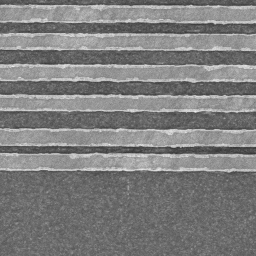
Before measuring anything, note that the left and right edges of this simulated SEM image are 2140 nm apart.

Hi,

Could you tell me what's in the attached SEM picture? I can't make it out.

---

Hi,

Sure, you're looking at parallel lines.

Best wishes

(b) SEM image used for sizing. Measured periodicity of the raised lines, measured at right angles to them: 248 nm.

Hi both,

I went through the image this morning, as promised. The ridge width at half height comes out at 135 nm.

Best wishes